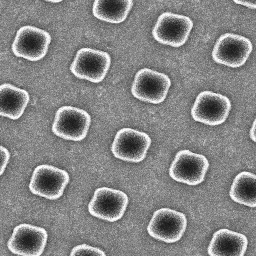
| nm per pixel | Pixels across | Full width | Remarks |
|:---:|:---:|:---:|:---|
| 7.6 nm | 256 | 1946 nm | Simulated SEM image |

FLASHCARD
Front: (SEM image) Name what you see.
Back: a regular array of raised bodies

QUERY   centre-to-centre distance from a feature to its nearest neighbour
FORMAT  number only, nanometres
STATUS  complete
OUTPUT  469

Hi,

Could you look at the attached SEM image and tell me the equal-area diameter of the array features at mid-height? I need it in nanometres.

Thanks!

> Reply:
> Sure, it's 264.